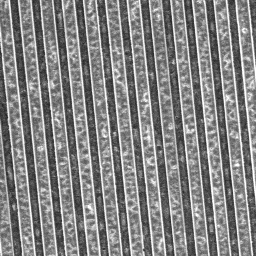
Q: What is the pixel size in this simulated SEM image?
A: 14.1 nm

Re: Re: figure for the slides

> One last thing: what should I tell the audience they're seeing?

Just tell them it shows parallel lines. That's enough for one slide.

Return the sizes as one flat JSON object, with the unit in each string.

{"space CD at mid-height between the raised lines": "139 nm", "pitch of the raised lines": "0.305 micrometres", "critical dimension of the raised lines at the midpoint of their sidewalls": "175 nm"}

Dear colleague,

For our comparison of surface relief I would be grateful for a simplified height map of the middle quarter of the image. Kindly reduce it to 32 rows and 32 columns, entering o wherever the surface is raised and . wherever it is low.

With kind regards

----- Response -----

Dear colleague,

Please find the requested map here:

.ooo...ooo..ooo...oo...ooo...oo.
.ooo...ooo..ooo...ooo..ooo...oo.
..oo...ooo..ooo...ooo..ooo...oo.
..oo...ooo..ooo...ooo..ooo...ooo
..oo...ooo...oo...ooo...oo...ooo
..ooo..ooo...ooo..ooo...oo...ooo
..ooo..ooo...ooo..ooo...oo...ooo
..ooo..ooo...ooo..ooo...ooo..ooo
..ooo...oo...ooo..ooo...ooo..ooo
..ooo...ooo..ooo..ooo...ooo..ooo
..ooo...ooo..ooo...oo...ooo...oo
..ooo...ooo..ooo...ooo..ooo...oo
...oo...ooo..ooo...ooo..ooo...oo
...oo...ooo..ooo...ooo..ooo...oo
...oo...ooo...ooo..ooo...oo...oo
...ooo..ooo...ooo..ooo...oo...oo
...ooo..ooo...ooo..ooo...ooo..oo
...ooo..ooo...ooo..ooo...ooo..oo
...ooo...ooo..ooo..ooo...ooo..oo
o..ooo...ooo..ooo..ooo...ooo..oo
o..ooo...ooo..ooo...ooo..ooo...o
o..ooo...ooo..ooo...ooo..ooo...o
o...oo...ooo..ooo...ooo..ooo...o
o...oo...ooo..ooo...ooo..ooo...o
o...ooo..ooo...ooo..ooo...oo...o
o...ooo..ooo...ooo..ooo...oo...o
o...ooo..ooo...ooo..ooo...ooo..o
o...ooo..ooo...ooo..ooo...ooo..o
oo..ooo...ooo..ooo..ooo...ooo..o
oo..ooo...ooo..ooo..ooo...ooo..o
oo..ooo...ooo..ooo...ooo..ooo...
oo..ooo...ooo..ooo...ooo..ooo...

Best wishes